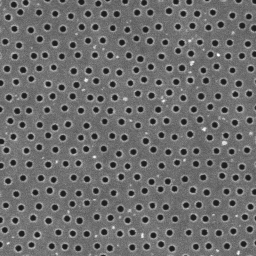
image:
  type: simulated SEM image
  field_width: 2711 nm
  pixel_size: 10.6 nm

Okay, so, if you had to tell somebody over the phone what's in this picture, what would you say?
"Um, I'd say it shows a regular array of holes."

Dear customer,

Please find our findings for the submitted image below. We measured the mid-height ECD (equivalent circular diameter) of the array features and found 5.97 px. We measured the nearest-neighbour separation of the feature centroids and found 139 nm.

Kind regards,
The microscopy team